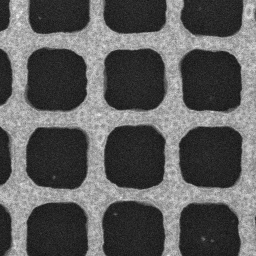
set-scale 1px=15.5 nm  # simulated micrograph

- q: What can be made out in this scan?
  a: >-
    holes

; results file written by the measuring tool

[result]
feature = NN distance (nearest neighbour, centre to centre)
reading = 1.19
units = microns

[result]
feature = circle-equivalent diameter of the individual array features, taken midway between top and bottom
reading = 1030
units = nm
